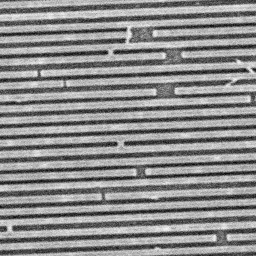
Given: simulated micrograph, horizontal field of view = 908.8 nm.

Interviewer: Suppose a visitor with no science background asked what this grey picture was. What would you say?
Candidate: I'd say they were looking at parallel lines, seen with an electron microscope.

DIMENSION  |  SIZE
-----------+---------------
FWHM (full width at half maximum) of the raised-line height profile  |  21.8 nm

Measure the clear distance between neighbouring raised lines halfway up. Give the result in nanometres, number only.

19.1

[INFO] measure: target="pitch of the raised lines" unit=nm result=40.7